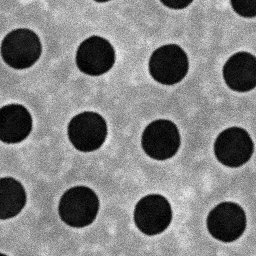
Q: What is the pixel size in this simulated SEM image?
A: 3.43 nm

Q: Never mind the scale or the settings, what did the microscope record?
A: a regular array of holes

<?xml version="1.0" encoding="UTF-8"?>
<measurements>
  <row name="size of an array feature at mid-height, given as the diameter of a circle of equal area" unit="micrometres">0.138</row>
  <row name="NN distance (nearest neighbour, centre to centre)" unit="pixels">73.9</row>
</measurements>